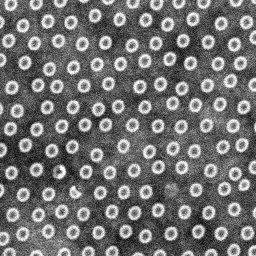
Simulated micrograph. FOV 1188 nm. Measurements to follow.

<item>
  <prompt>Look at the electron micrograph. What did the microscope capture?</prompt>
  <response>a regular array of raised bodies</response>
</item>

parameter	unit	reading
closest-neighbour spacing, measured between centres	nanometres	99.3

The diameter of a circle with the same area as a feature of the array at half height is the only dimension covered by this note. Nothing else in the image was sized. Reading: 0.0592 microns